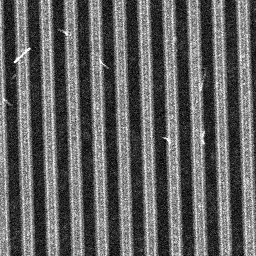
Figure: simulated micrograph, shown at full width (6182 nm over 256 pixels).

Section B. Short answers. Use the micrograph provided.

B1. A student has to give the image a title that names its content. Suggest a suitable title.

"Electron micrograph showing parallel lines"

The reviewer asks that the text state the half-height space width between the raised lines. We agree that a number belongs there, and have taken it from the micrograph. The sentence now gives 0.362 µm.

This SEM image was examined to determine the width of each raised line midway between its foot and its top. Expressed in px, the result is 9.37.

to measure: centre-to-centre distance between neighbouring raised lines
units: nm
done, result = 595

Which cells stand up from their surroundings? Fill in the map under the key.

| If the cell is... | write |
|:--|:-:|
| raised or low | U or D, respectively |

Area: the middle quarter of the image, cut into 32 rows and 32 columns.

DUUDDDDUUDDDDUUDDDDUUUDDDDUUDDDD
DUUDDDDUUDDDDUUDDDDUUUDDDDUUDDDD
DUUDDDDUUDDDDUUDDDDUUUDDDDUUDDDD
DUUDDDDUUDDDDUUDDDDUUUDDDDUUDDDD
DUUDDDDUUDDDDUUDDDDUUUDDDDUUDDDD
DUUDDDDUUDDDDUUDDDDUUUDDDDUUDDDD
DUUDDDDUUDDDDUUDDDDUUUDDDDUUDDDD
DUUDDDDUUDDDDUUUDDDUUUDDDDUUDDDD
DUUDDDDUUDDDDUUUDDDDUUDDDDUUDDDD
DUUDDDDUUDDDDUUUDDDDUUDDDDUUDDDD
DUUDDDDUUUDDDUUUDDDDUUDDDDUUDDDD
DUUDDDDUUUDDDDUUDDDDUUDDDDUUDDDD
DUUDDDDUUUDDDDUUDDDDUUDDDDUUDDDD
DUUUDDDUUUDDDDUUDDDDUUDDDDUUDDDD
DUUUDDDDUUDDDDUUDDDDUUDDDDUUDDDD
DUUUDDDDUUDDDDUUDDDDUUDDDDUUDDDD
DUUUDDDDUUDDDDUUDDDDUUDDDDUUDDDD
DDUUDDDDUUDDDDUUDDDDUUDDDDUUDDDD
DDUUDDDDUUDDDDUUDDDDUUDDDDUUDDDD
DDUUDDDDUUDDDDUUDDDDUUDDDDUUDDDD
DDUUDDDDUUDDDDUUDDDDUUDDDDUUDDDD
DDUUDDDDUUDDDDUUDDDDUUDDDDUUDDDD
DDUUDDDDUUDDDDUUDDDDUUDDDDUUDDDD
DDUUDDDDUUDDDDUUDDDDUUDDDDUUDDDD
DDUUDDDDUUDDDDUUDDDDUUDDDDUUDDDD
DDUUDDDDUUDDDDUUDDDDUUDDDDUUDDDD
DDUUDDDDUUDDDDUUDDDDUUDDDDUUUDDD
DDUUDDDDUUDDDDUUDDDDUUDDDDUUUDDD
DDUUDDDDUUDDDDUUDDDDUUDDDDUUUDDD
DDUUDDDDUUDDDDUUDDDDUUUDDDUUUDDD
DDUUDDDDUUDDDDUUDDDDUUUDDDDUUDDD
DDUUDDDDUUDDDDUUDDDDUUUDDDUUUDDD